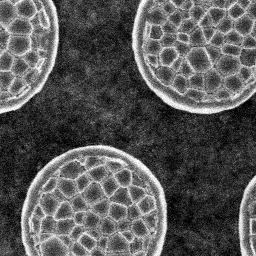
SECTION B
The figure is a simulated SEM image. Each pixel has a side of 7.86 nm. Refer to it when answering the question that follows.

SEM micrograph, raised bodies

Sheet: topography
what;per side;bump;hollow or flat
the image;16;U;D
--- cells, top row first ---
UUUDDDDDDUUUUUUU
UUUUDDDDUUUUUUUU
UUUUDDDDUUUUUUUU
UUUDDDDDDUUUUUUU
UUUDDDDDDUUUUUUU
UUDDDDDDDDUUUUUU
UDDDDDDDDDDUUUUD
DDDDDDDDDDDDDDDD
DDDDDDDDDDDDDDDD
DDDDUUUUDDDDDDDD
DDDUUUUUUDDDDDDD
DDUUUUUUUUDDDDDD
DDUUUUUUUUDDDDDU
DUUUUUUUUUDDDDDU
DUUUUUUUUUDDDDDU
DDUUUUUUUUDDDDDU